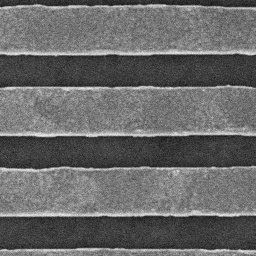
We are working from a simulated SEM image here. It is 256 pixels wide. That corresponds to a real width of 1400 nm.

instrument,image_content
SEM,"lines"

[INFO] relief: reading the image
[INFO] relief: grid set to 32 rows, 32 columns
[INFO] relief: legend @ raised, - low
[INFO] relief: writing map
--------------------------------
@@@@@@@@@@@@@@@@@@@@@@@@@@@@@@@@
@@@@@@@@@@@@@@@@@@@@@@@@@@@@@@@@
@@@@@@@@@@@@@@@@@@@@@@@@@@@@@@@@
@@@@@@@@@@@@@@@@@@@@@@@@@@@@@@@@
@@@@@@@@@@@@@@@@@@@@@@@@@@@@@@@@
@@@@@@@@@@@@@@@@@@@@@@@@@@@@@@@@
--------------------------------
--------------------------------
--------------------------------
--------------------------------
@@@@@@@@@@@@@@@@@@@@@@@@@@@@@@@@
@@@@@@@@@@@@@@@@@@@@@@@@@@@@@@@@
@@@@@@@@@@@@@@@@@@@@@@@@@@@@@@@@
@@@@@@@@@@@@@@@@@@@@@@@@@@@@@@@@
@@@@@@@@@@@@@@@@@@@@@@@@@@@@@@@@
@@@@@@@@@@@@@@@@@@@@@@@@@@@@@@@@
--------------------------------
--------------------------------
--------------------------------
--------------------------------
@@@@@@@@@@@@@@@@@@@@@@@@@@@@@@@@
@@@@@@@@@@@@@@@@@@@@@@@@@@@@@@@@
@@@@@@@@@@@@@@@@@@@@@@@@@@@@@@@@
@@@@@@@@@@@@@@@@@@@@@@@@@@@@@@@@
@@@@@@@@@@@@@@@@@@@@@@@@@@@@@@@@
@@@@@@@@@@@@@@@@@@@@@@@@@@@@@@@@
--------------------------------
--------------------------------
--------------------------------
--------------------------------
@@@@@@@@@@@@@@@@@@@@@@@@@@@@@@@@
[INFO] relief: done